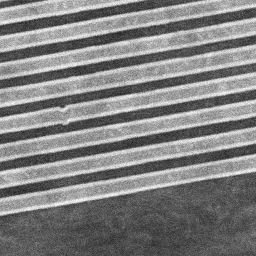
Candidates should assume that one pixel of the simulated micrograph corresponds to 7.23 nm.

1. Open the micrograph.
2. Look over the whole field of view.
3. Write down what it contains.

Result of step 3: parallel lines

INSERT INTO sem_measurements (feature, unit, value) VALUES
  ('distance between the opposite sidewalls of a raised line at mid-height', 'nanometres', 106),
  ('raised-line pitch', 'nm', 194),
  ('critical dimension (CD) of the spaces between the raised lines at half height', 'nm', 91.6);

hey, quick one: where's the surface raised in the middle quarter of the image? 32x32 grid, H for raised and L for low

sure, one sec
HLLLLLLLLLLLLLLLLLLLHHHHHHHHHHHH
LLLLLLLLLLLLLLHHHHHHHHHHHHHHHHHH
LLLLLLLLHHHHHHHHHHHHHHHHHHHHHLLL
LLHHHHHHHHHHHHHHHHHHHHHLLLLLLLLL
HHHHHHHHHHHHHHHHHLLLLLLLLLLLLLLL
HHHHHHHHHHHHLLLLLLLLLLLLLLLLLLLH
HHHHHHLLLLLLLLLLLLLLLLLLLHHHHHHH
LLLLLLLLLLLLLLLLLLLHHHHHHHHHHHHH
LLLLLLLLLLLLLLHHHHHHHHHHHHHHHHHH
LLLLLLLLHHHHHHHHHHHHHHHHHHHHLLLL
LLHHHHHHHHHHHHHHHHHHHLLLLLLLLLLL
HHHHHHHHHHHHHHHHLLLLLLLLLLLLLLLL
HHHHHHHHHHLLLLLLLLLLLLLLLLLLLLHH
HHHHHHLLLLLLLLLLLLLLLLLLLHHHHHHH
HLLLLLLLLLLLLLLLLLLHHHHHHHHHHHHH
LLLLLLLLLLLLHHHHHHHHHHHHHHHHHHHH
LLLLLLHHHHHHHHHHHHHHHHHHHHHLLLLL
HHHHHHHHHHHHHHHHHHHHHLLLLLLLLLLL
HHHHHHHHHHHHHHHLLLLLLLLLLLLLLLLL
HHHHHHHHHHLLLLLLLLLLLLLLLLLLLHHH
HHHHLLLLLLLLLLLLLLLLLLLHHHHHHHHH
LLLLLLLLLLLLLLLLLHHHHHHHHHHHHHHH
LLLLLLLLLLLHHHHHHHHHHHHHHHHHHHHL
LLLLLLHHHHHHHHHHHHHHHHHHHLLLLLLL
HHHHHHHHHHHHHHHHHHHLLLLLLLLLLLLL
HHHHHHHHHHHHHHLLLLLLLLLLLLLLLLLL
HHHHHHHHLLLLLLLLLLLLLLLLLLLHHHHH
HHLLLLLLLLLLLLLLLLLLLHHHHHHHHHHH
LLLLLLLLLLLLLLLHHHHHHHHHHHHHHHHH
LLLLLLLLLLHHHHHHHHHHHHHHHHHHHHLL
LLLLHHHHHHHHHHHHHHHHHHHHHLLLLLLL
HHHHHHHHHHHHHHHHHHHLLLLLLLLLLLLL